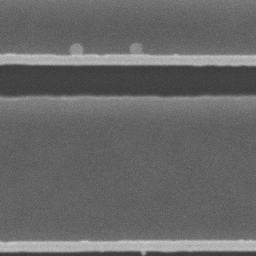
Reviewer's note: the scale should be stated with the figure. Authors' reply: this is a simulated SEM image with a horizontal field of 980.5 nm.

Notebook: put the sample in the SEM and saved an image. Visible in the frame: lines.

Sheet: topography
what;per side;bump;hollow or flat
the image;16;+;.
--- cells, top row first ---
++++++++++++++++
++++++++++++++++
++++++++++++++++
++++++++++++++++
................
................
++++++++++++++++
++++++++++++++++
++++++++++++++++
++++++++++++++++
++++++++++++++++
++++++++++++++++
++++++++++++++++
++++++++++++++++
++++++++++++++++
++++++++++++++++